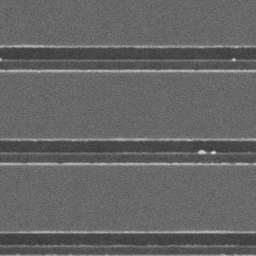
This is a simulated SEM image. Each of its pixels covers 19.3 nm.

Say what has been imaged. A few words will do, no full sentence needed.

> lines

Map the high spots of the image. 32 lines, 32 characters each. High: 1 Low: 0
11111111111111111111111111111111
11111111111111111111111111111111
11111111111111111111111111111111
11111111111111111111111111111111
11111111111111111111111111111111
11111111111111111111111111111111
00000000000000000000000000000000
00000000000000000000000000000000
00000000000000000000000000000000
11111111111111111111111111111111
11111111111111111111111111111111
11111111111111111111111111111111
11111111111111111111111111111111
11111111111111111111111111111111
11111111111111111111111111111111
11111111111111111111111111111111
11111111111111111111111111111111
00000010010000000100000101000100
00000000000000000000000000000000
00000000000000000000000000000000
11111111111111111111111111111111
11111111111111111111111111111111
11111111111111111111111111111111
11111111111111111111111111111111
11111111111111111111111111111111
11111111111111111111111111111111
11111111111111111111111111111111
11111111111111111111111111111111
11111111111111111111111111111111
00000000000000000000000000000000
00000000000000000000000000000000
00000000000000000000000000000000